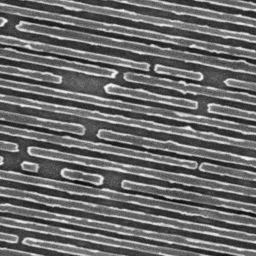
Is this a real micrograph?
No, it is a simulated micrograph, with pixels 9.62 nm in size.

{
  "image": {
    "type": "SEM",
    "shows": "parallel lines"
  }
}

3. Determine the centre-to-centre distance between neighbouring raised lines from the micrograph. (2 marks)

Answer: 15.1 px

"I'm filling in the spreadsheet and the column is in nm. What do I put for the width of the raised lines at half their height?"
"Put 78.1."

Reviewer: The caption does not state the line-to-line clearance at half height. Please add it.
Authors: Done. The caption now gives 69.8 nanometres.